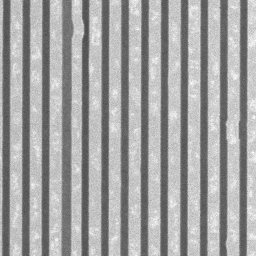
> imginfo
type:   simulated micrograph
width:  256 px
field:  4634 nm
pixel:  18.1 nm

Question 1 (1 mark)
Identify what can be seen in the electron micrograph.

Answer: parallel lines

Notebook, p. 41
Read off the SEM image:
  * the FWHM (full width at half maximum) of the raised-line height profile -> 12.1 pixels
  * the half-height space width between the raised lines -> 0.134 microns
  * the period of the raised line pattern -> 358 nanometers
